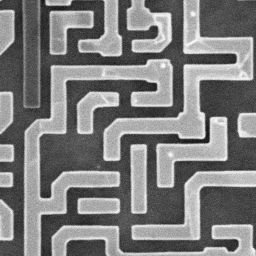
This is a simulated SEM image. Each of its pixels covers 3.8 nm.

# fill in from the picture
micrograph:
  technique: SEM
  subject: wiring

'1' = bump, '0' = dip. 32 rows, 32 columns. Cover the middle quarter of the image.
00000000000000000000111111100011
11111111111111111111111111100011
11111111111111111111111111100011
11111111111111111111111111100011
00000000000000000000011111100011
00000000000000000000000111100011
00000000000000000000000111100011
00000011111110000111111111100011
00000111111111000111111111100011
00001111111111000111111111100011
00011111110000000000000000000011
00011110000000000000000000000011
00011110000000000000000000000111
00011110000000000000000000001111
00011110000011111111111111111111
00011110000111111111111111111111
00011110001111111111111111111111
00000000001111100000000000000111
00000000001111000000000000000000
00000000001111000000000000000000
00000000001111000111000111111111
00000000001111000111000111111111
00000000001111000111000111111111
00000000001111000111000111111111
00000000000000000111000111110000
00000000000000000111000111100000
00000000000000000111000111100000
11111111111111000111000111100000
11111111111111000111000111100000
11111111111111000111000111100001
11111111111100000111000011100011
10000000000000000111000000000011